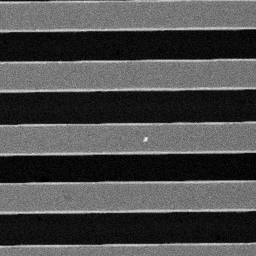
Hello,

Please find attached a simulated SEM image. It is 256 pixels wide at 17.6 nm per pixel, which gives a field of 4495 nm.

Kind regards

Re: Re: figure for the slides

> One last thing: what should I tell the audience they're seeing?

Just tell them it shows lines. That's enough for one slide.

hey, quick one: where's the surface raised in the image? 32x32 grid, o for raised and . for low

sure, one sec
oooooooooooooooooooooooooooooooo
oooooooooooooooooooooooooooooooo
oooooooooooooooooooooooooooooooo
oooooooooooooooooooooooooooooooo
................................
................................
................................
..........................oooooo
oooooooooooooooooooooooooooooooo
oooooooooooooooooooooooooooooooo
oooooooooooooooooooooooooooooooo
ooo.............................
................................
................................
................................
............oooooooooooooooooooo
oooooooooooooooooooooooooooooooo
oooooooooooooooooooooooooooooooo
oooooooooooooooooooooooooooooooo
................................
................................
................................
................................
oooooooooooooooooooooooooooooooo
oooooooooooooooooooooooooooooooo
oooooooooooooooooooooooooooooooo
oooooooooooooooooo.o............
................................
................................
................................
.....................ooooooooooo
oooooooooooooooooooooooooooooooo